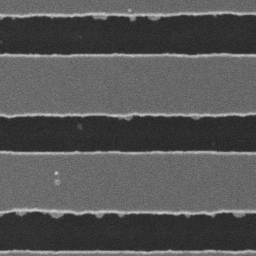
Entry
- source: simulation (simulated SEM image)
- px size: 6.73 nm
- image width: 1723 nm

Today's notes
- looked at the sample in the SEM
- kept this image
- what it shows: lines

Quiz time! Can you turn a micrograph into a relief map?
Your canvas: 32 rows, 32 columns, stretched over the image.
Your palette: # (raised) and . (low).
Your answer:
################################
################################
................................
................................
................................
................................
................................
################################
################################
################################
################################
################################
################################
################################
###########..###.#.##########.#.
................................
................................
................................
................................
################################
################################
################################
################################
################################
################################
################################
#......#####################..##
................................
................................
................................
................................
################################